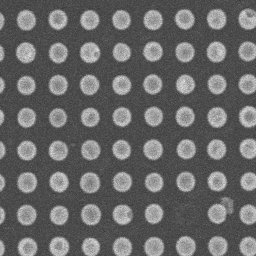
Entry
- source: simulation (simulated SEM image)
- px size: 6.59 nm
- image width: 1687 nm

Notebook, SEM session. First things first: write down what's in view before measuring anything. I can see a regular array of raised bodies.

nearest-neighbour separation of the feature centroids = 208 nm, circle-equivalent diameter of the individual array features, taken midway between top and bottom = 119 nanometres